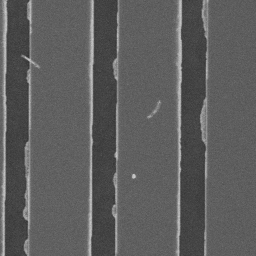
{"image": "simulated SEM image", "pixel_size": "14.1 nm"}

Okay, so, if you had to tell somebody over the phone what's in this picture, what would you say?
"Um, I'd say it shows lines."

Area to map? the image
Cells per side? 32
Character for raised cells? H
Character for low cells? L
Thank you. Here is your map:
HLLLHHHHHHHHLLLHHHHHHHHLLLHHHHHH
HLLLHHHHHHHHLLLHHHHHHHHLLLHHHHHH
HLLLHHHHHHHHLLLHHHHHHHHLLLHHHHHH
HLLLHHHHHHHHLLLHHHHHHHHLLLHHHHHH
HLLLHHHHHHHHLLLHHHHHHHHLLLHHHHHH
HLLLHHHHHHHHLLLHHHHHHHHLLLHHHHHH
HLLLHHHHHHHHLLLHHHHHHHHLLLHHHHHH
HLLLHHHHHHHHLLLHHHHHHHHLLLHHHHHH
HLLLHHHHHHHHLLLHHHHHHHHLLLHHHHHH
HLLLHHHHHHHHLLLHHHHHHHHLLLHHHHHH
HLLLHHHHHHHHLLLHHHHHHHHLLLHHHHHH
HLLLHHHHHHHHLLLHHHHHHHHLLLHHHHHH
HLLLHHHHHHHHLLLHHHHHHHHLLLHHHHHH
HLLLHHHHHHHHLLLHHHHHHHHLLLHHHHHH
HLLLHHHHHHHHLLLHHHHHHHLLLLHHHHHH
HLLLHHHHHHHLLLLHHHHHHHLLLLHHHHHH
HLLLHHHHHHHLLLLHHHHHHHLLLLHHHHHH
HLLLHHHHHHHLLLLHHHHHHHLLLLHHHHHH
HLLLHHHHHHHLLLLHHHHHHHLLLLHHHHHH
HLLLHHHHHHHLLLLHHHHHHHHLLLHHHHHH
HLLLHHHHHHHLLLLHHHHHHHLLLLHHHHHH
HLLLHHHHHHHLLLLHHHHHHHLLLLHHHHHH
HLLLHHHHHHHLLLLHHHHHHHLLLLHHHHHH
HLLLHHHHHHHLLLLHHHHHHHLLLLHHHHHH
HLLLHHHHHHHLLLLHHHHHHHLLLLHHHHHH
HLLLHHHHHHHLLLLHHHHHHHLLLLHHHHHH
HLLLHHHHHHHLLLLHHHHHHHLLLLHHHHHH
HLLLHHHHHHHLLLHHHHHHHHLLLLHHHHHH
HLLLHHHHHHHLLLHHHHHHHHLLLLHHHHHH
HLLLHHHHHHHLLLHHHHHHHHLLLLHHHHHH
HLLLHHHHHHHLLLHHHHHHHHLLLLHHHHHH
HLLLHHHHHHHLLLHHHHHHHHLLLLHHHHHH